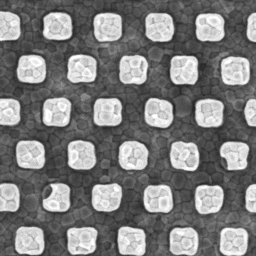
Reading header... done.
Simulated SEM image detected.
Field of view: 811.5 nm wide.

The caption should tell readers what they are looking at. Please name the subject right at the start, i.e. a regular array of raised bodies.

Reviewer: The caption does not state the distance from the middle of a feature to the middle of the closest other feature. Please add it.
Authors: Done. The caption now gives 156 nm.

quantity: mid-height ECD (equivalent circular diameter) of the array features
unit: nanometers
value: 95.2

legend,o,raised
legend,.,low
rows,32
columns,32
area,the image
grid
................................
o...............................
oo....ooo...ooo...oooo...ooo...o
oo...oooo...ooo...oooo...ooo...o
oo....ooo...ooo...oooo...ooo...o
................................
................................
..ooo....ooo...ooo....ooo...ooo.
..oooo..oooo...ooo...oooo...ooo.
..oooo..oooo...ooo...oooo...ooo.
............................ooo.
................................
oo....oo....ooo....o.....oo....o
oo...oooo...ooo...oooo...ooo...o
oo...oooo...ooo...oooo..oooo...o
oo....oo....ooo....oo....ooo...o
................................
................................
..ooo....ooo...ooo...oooo...ooo.
..oooo...ooo...ooo...oooo...ooo.
..oooo...ooo...ooo....ooo...ooo.
................................
................................
oo.....oo...ooo...ooo....ooo...o
oo....ooo...ooo...oooo..oooo...o
oo...oooo...ooo...oooo..oooo...o
...................oo....oo.....
................................
...oo.....oo...oo......o........
..ooo...oooo...ooo...oooo...ooo.
..ooo....ooo...ooo...oooo...ooo.
..ooo....oo....ooo....oo....ooo.